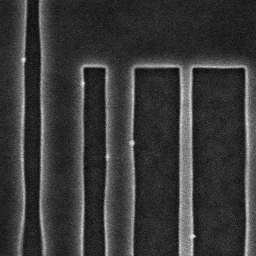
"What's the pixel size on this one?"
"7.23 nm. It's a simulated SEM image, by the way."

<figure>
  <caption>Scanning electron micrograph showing groups of lines, slits or small figures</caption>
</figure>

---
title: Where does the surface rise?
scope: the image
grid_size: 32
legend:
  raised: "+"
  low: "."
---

+++..+++++++++++++++++++++++++++
+++..+++++++++++++++++++++++++++
+++..+++++++++++++++++++++++++++
+++..+++++++++++++++++++++++++++
+++..+++++++++++++++++++++++++++
+++..+++++++++++++++++++++++++++
+++..+++++++++++++++++++++++++++
+++..+++++++++++++++++++++++++++
+++..++++++..++++.....++......++
+++..+++++...++++......+.......+
+++..+++++...++++......+.......+
+++..+++++...++++......+.......+
+++..+++++...++++......+.......+
+++..+++++...++++......+.......+
+++..+++++...++++......+.......+
+++..+++++...++++......+.......+
+++..+++++...+++.......+.......+
+++..+++++...++++......+.......+
+++..+++++...++++......+.......+
+++..+++++...++++......+.......+
+++..+++++...++++......+.......+
+++..+++++...++++.....++.......+
+++..+++++...++++.....++.......+
+++..+++++...++++.....++.......+
+++..+++++...++++......+.......+
+++..+++++...++++.....++.......+
+++..+++++...++++.....++.......+
+++..+++++...++++.....++.......+
+++..+++++...++++.....++.......+
+++..+++++...++++.....++.......+
+++..+++++...++++.....++.......+
+++...++++...++++.....++.......+